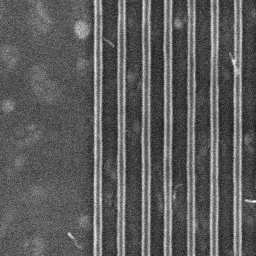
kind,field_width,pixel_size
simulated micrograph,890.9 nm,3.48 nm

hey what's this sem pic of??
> parallel lines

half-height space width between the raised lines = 0.057 microns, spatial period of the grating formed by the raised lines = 23.2 px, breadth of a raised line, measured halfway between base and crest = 22.2 nm